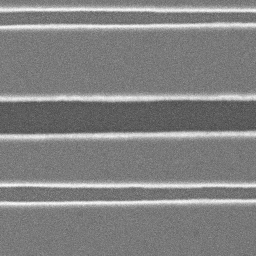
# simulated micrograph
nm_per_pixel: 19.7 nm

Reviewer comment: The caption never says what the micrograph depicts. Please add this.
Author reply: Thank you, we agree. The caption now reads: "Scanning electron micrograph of lines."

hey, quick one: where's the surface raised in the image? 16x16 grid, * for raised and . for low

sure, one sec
****************
****************
****************
****************
****************
****************
................
................
.........*******
****************
****************
****************
****************
****************
****************
****************